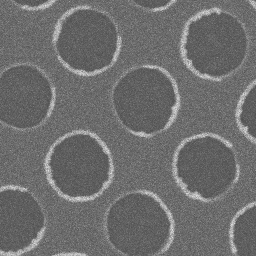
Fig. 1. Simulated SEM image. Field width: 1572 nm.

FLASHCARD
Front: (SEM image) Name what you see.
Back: holes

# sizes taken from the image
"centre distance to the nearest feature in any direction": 90.8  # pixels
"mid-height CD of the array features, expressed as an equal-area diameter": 378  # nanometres